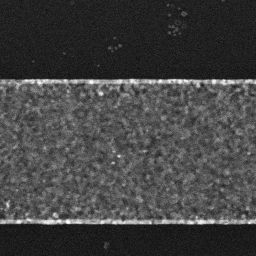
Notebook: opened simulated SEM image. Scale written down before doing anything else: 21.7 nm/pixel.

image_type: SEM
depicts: wiring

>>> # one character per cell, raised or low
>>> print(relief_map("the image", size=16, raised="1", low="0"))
0000000000000000
0000000000000000
0000000000000000
0000000000000000
0000000000000000
1111111111111111
1111111111111111
1111111111111111
1111111111111111
1111111111111111
1111111111111111
1111111111111111
1111111111111111
1111111111111111
0000000000000000
0000000000000000